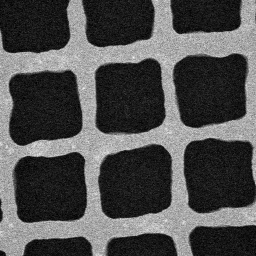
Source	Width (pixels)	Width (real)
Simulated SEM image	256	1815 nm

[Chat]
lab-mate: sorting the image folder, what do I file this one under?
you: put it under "holes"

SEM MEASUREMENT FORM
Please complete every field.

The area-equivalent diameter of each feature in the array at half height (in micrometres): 0.546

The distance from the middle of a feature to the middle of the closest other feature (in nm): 578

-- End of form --